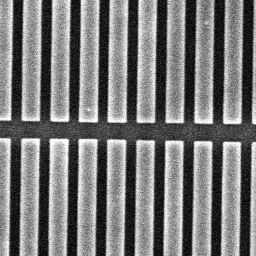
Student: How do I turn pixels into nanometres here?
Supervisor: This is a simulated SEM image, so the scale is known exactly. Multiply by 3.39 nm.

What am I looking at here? groups of lines, slits or small figures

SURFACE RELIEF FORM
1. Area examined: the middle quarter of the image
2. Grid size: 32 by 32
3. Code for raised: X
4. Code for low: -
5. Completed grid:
X---XXXX---XXXXX---XXXX---XXXX--
X---XXXX---XXXXX---XXXX---XXXX--
X---XXXX---XXXXX---XXXX---XXXX--
X---XXXX---XXXX----XXXX---XXXX--
X---XXXX---XXXX----XXXX---XXXX--
X---XXXX---XXXX----XXXX---XXXX--
X---XXXX---XXXX----XXXX---XXXX--
X---XXXX---XXXX----XXXX---XXXX--
X---XXXX---XXXX----XXXX---XXXX--
X---XXXX---XXXX---XXXXX---XXXX--
X---XXXX---XXXX---XXXXX---XXXX--
X---XXXX---XXXX---XXXXX---XXXX--
X---XXXX---XXXX---XXXXX---XXXX--
X---XXXX---XXXX---XXXXX---XXXX--
------------XXX----XXXX---XXXX--
--------------------------------
--------------------------------
--------------------------------
--------------------------------
X---XXXX---XXXX---XXXXX---XXXX--
X---XXXX---XXXX---XXXXX---XXXX--
X---XXXX---XXXX---XXXXX---XXXX--
X---XXXX---XXXX---XXXXX---XXXX--
X---XXXX---XXXX---XXXXX---XXXX--
X---XXXX---XXXX---XXXX---XXXXX--
X---XXXX---XXXX---XXXX---XXXXX--
X---XXXX---XXXX---XXXX---XXXXX--
X---XXXX---XXXX---XXXX---XXXXX--
X---XXXX---XXXX---XXXX---XXXXX--
X---XXXX---XXXX---XXXX---XXXXX--
X---XXXX---XXXX---XXXX---XXXXX--
X---XXXX---XXXX---XXXX---XXXXX--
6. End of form